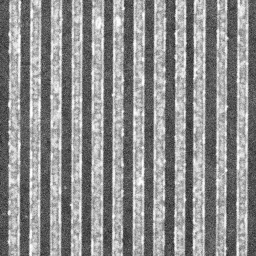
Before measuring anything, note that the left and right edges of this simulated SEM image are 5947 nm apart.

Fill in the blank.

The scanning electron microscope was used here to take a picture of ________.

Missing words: parallel lines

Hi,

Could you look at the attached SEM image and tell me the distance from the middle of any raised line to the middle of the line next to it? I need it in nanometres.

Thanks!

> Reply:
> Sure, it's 482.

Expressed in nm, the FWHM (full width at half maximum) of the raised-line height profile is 226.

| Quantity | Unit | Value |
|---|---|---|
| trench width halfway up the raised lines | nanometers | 250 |